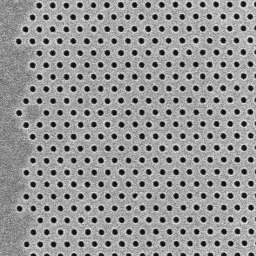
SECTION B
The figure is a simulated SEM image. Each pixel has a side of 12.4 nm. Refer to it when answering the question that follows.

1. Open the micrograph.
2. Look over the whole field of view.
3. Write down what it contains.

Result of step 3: a regular array of holes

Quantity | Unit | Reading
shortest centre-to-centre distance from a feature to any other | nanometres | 167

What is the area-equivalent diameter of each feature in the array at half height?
73 nanometres